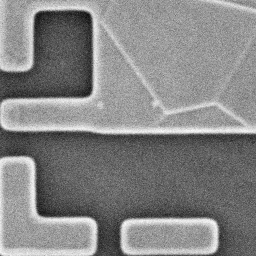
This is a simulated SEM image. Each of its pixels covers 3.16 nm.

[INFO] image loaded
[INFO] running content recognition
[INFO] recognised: wiring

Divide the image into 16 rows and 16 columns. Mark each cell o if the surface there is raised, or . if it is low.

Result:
oooooooooooooooo
oo....oooooooooo
oo....oooooooooo
oo....oooooooooo
......oooooooooo
......oooooooooo
oooooooooooooooo
oooooooooooooooo
................
................
oo..............
oo..............
oo..............
ooo.............
oooooo..oooooo..
oooooo..ooooo...